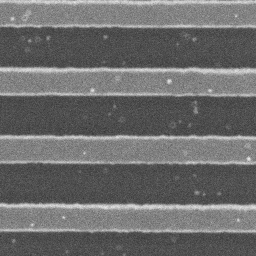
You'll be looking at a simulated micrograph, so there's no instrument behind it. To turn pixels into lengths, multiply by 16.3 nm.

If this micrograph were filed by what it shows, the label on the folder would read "lines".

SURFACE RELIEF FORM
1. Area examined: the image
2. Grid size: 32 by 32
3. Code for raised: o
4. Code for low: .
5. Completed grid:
oooooooooooooooooooooooooooooooo
oooooooooooooooooooooooooooooooo
oooooooooooooooooooooooooooooooo
................................
................................
................................
................................
................................
oo..............................
oooooooooooooooooooooooooooooooo
oooooooooooooooooooooooooooooooo
oooooooooooooooooooooooooooooooo
................................
................................
................................
................................
................................
oooooooooooooooooooooooooooooooo
oooooooooooooooooooooooooooooooo
oooooooooooooooooooooooooooooooo
................................
................................
................................
................................
................................
o.....o.........................
oooooooooooooooooooooooooooooooo
oooooooooooooooooooooooooooooooo
oooooooooooooooooooooooooooooooo
................................
................................
................................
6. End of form